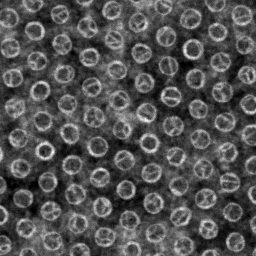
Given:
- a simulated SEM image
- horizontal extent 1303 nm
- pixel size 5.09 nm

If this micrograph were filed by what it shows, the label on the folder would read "a regular array of raised bodies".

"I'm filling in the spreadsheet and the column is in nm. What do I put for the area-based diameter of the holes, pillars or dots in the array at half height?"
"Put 89.2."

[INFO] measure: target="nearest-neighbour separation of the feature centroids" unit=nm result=149